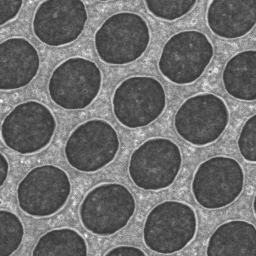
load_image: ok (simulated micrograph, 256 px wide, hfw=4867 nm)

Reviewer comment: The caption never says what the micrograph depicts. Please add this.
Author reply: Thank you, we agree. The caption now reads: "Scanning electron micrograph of a regular array of holes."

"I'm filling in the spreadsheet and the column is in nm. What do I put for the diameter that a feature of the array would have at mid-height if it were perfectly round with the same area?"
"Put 989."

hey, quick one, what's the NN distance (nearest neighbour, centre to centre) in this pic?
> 64.6 pixels